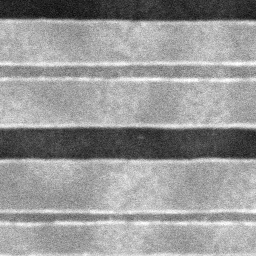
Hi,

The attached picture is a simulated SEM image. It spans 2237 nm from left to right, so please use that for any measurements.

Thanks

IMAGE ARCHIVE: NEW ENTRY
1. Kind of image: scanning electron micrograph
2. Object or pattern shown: lines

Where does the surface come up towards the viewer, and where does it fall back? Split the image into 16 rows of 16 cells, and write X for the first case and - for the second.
----------------
XXXXXXXXXXXXXXXX
XXXXXXXXXXXXXXXX
XXXXXXXXXXXXXXXX
XXXXXXXXXXXXXXXX
XXXXXXXXXXXXXXXX
XXXXXXXXXXXXXXXX
XXXXXXXXXXXXXXXX
----------------
----------------
XXXXXXXXXXXXXXXX
XXXXXXXXXXXXXXXX
XXXXXXXXXXXXXXXX
XXXXXXXXXXXXXXXX
XXXXXXXXXXXXXXXX
XXXXXXXXXXXXXXXX